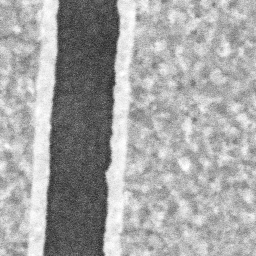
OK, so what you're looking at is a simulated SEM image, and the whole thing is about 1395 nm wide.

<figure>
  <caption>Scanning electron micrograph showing one or a few lines or trenches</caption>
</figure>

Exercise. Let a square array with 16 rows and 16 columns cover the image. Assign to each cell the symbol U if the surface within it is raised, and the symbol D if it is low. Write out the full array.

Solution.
UUUDDDDDUUUUUUUU
UUUDDDDDUUUUUUUU
UUUDDDDDUUUUUUUU
UUUDDDDDUUUUUUUU
UUUDDDDDUUUUUUUU
UUUDDDDDUUUUUUUU
UUUDDDDDUUUUUUUU
UUUDDDDDUUUUUUUU
UUUDDDDDUUUUUUUU
UUUDDDDUUUUUUUUU
UUUDDDDUUUUUUUUU
UUDDDDDUUUUUUUUU
UUDDDDDUUUUUUUUU
UUDDDDDUUUUUUUUU
UUDDDDDUUUUUUUUU
UUDDDDDUUUUUUUUU